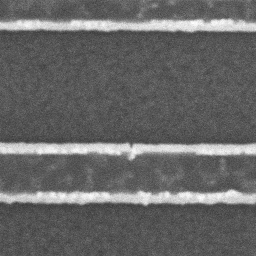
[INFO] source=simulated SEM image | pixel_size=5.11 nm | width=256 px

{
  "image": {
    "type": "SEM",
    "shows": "one or a few lines or trenches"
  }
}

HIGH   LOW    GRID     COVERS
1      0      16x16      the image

1111111111111111
1111111111111111
0000000000000000
0000000000000000
0000000000000000
0000000000000000
0000000000000000
0000000000000000
0000000000000000
1111111111111111
1111111111111111
1111111111111111
0000000001001000
0000000000000000
0000000000000000
0000000000000000